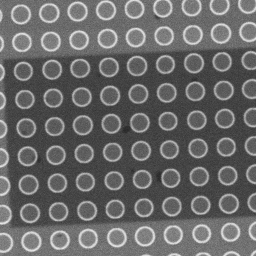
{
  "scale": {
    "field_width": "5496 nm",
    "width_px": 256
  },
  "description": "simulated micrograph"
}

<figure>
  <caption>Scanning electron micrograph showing an array of small figures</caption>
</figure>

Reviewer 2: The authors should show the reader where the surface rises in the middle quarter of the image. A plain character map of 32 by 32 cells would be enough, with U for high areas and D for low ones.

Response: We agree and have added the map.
DDUUUUDDDUUUUUDDUUUUUDDUUUUUDDUU
DDUUUUDDDUUUUUDDUUUUDDDUUUUDDDDU
DDUUUUDDDDUUUDDDDUUUDDDDDDDDDDDD
DDDDDDDDDDDDDDDDDDDDDDDDDDDDDDDD
DDDDDDDDDDDDDDDDDDDDDDDDDDDDDDDD
DDDDDDDDDDDDDDDDDUUUDDDDUUUDDDDU
DDDUUUDDDDUUUUDDUUUUUDDDUUUUDDDU
DDUUUUUDDUUUUUDDUUUUUDDUUUUUDDDU
DDUUUUUDDUUUUUDDUUUUUDDDUUUUDDDU
DDUUUUUDDDUUUDDDDUUUDDDDDUDDDDDD
DDDDUUDDDDDDDDDDDDDDDDDDDDDDDDDD
DDDDDDDDDDDDDDDDDDDDDDDDDDDDDDDD
DDDDDDDDDDDDDDDDDDDUDDDDUUUDDDDD
DDDUUUDDDDUUUUDDDUUUUDDDUUUUDDDU
DDUUUUUDDDUUUUDDDUUUUDDDUUUUDDDU
DDUUUUUDDUUUUUDDDUUUUDDDUUUUDDDU
DDDUUUUDDDUUUUDDDUUUDDDDDDDDDDDD
DDDDUUDDDDDDDDDDDDDDDDDDDDDDDDDD
DDDDDDDDDDDDDDDDDDDDDDDDDDDDDDDD
DDDDDDDDDDDDDDDDDDUUDDDDDUUUDDDD
DDDDUUDDDDUUUUDDDUUUUDDDUUUUDDDU
DDDUUUUDDDUUUUDDDUUUUUDDUUUUUDDU
DDDUUUUDDDUUUUDDDUUUUDDDUUUUDDDD
DDDUUUUDDDUUUUDDDDUUUDDDDDUDDDDD
DDDDUUDDDDDDDDDDDDDDDDDDDDDDDDDD
DDDDDDDDDDDDDDDDDDDDDDDDDDDDDDDD
DDDDDDDDDDDDDDDDDDDDDDDDDDUUDDDD
DDDDUUDDDDDUUUDDDDUUUDDDDUUUUDDD
DDDUUUUDDDUUUUUDDUUUUUDDDUUUUDDD
UDDUUUUUDDUUUUUDDUUUUUDDDUUUUDDD
UDDUUUUDDDDUUUDDDDUUUDDDDUUUDDDD
DDDDUUDDDDDDDDDDDDDDDDDDDDDDDDDD